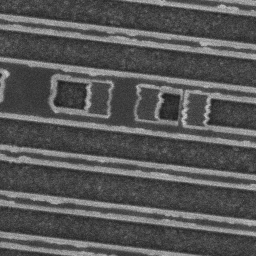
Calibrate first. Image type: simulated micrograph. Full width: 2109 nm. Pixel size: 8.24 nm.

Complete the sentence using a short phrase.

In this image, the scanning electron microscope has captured parallel lines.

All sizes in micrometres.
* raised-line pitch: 0.359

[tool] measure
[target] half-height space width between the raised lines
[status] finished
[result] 256 nanometres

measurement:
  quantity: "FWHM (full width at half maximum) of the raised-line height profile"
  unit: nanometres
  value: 97.2